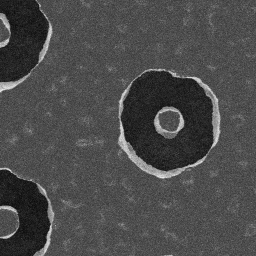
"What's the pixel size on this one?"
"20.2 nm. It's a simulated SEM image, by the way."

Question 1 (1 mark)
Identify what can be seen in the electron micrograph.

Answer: ring-shaped grooves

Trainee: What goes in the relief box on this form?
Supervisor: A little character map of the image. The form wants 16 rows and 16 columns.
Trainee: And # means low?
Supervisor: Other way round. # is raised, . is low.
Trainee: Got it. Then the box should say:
...#############
#..#############
#..#############
...#############
..#######.######
########.....###
########......##
########..#...##
########.....###
########.....###
#########...####
..##############
...#############
#..#############
#..#############
...#############